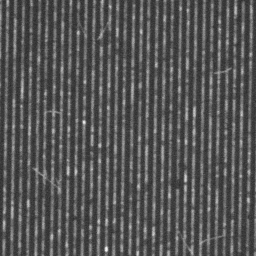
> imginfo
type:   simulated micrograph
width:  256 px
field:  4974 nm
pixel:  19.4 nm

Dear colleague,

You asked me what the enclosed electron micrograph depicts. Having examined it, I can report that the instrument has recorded parallel lines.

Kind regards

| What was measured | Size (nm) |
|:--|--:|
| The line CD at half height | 36.4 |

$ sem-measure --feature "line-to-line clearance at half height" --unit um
0.121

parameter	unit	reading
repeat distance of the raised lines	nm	153